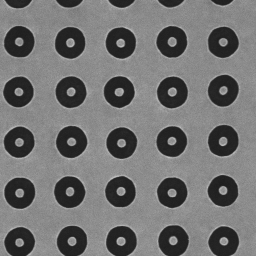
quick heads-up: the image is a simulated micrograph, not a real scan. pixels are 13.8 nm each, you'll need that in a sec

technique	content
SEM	a regular array of ring-shaped grooves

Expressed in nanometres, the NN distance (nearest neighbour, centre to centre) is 684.